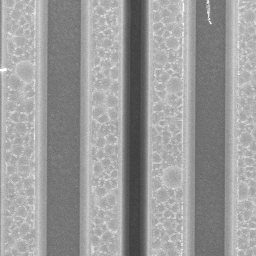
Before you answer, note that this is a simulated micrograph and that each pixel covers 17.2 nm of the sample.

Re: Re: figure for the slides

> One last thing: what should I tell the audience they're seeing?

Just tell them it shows one or a few lines or trenches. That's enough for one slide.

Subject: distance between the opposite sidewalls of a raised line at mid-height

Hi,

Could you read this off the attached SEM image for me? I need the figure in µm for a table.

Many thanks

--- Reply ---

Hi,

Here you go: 0.741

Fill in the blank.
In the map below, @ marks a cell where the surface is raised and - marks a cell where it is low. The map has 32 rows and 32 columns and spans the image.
@@@@@------@@@@@--@@@@@@-----@@@
@@@@@------@@@@@--@@@@@@-----@@@
@@@@@------@@@@@--@@@@@@-----@@@
@@@@@------@@@@@--@@@@@@-----@@@
@@@@@------@@@@@--@@@@@@-----@@@
@@@@@------@@@@@--@@@@@@-----@@@
@@@@@------@@@@@--@@@@@@-----@@@
@@@@@------@@@@@--@@@@@@-----@@@
@@@@@------@@@@@--@@@@@@-----@@@
@@@@@------@@@@@--@@@@@@-----@@@
@@@@@------@@@@@--@@@@@@-----@@@
@@@@@------@@@@@--@@@@@@-----@@@
@@@@@------@@@@@--@@@@@@-----@@@
@@@@@------@@@@@--@@@@@@-----@@@
@@@@@------@@@@@--@@@@@@-----@@@
@@@@@------@@@@@--@@@@@@-----@@@
@@@@@------@@@@@--@@@@@@-----@@@
@@@@@------@@@@@--@@@@@@-----@@@
@@@@@------@@@@@--@@@@@@-----@@@
@@@@@------@@@@@--@@@@@@-----@@@
@@@@@------@@@@@--@@@@@@-----@@@
@@@@@------@@@@@--@@@@@@-----@@@
@@@@@------@@@@@--@@@@@@-----@@@
@@@@@------@@@@@--@@@@@@-----@@@
@@@@@------@@@@@--@@@@@@-----@@@
@@@@@------@@@@@--@@@@@@-----@@@
@@@@@------@@@@@--@@@@@@-----@@@
@@@@@------@@@@@--@@@@@@-----@@@
@@@@@------@@@@@--@@@@@@-----@@@
@@@@@------@@@@@--@@@@@@-----@@@
@@@@@------@@@@@--@@@@@@-----@@@
@@@@@------@@@@@--@@@@@@-----@@@